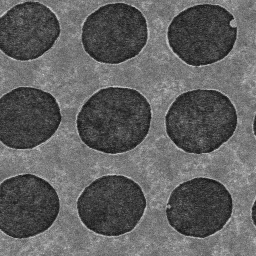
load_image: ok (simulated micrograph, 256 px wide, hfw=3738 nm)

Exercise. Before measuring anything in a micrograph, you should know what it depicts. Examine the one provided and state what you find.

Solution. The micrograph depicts holes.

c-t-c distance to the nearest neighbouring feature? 1260 nm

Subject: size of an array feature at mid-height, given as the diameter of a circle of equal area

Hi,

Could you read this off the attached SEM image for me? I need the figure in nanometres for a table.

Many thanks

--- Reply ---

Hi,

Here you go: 954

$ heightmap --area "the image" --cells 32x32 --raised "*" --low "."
**...*********..****************
*......*****......*****......***
.......****.......****.......***
........**........***.........**
.......***.........**.........**
.......***........***........***
......*****.......****.......***
**..********....*******.....****
********************************
********************************
********************************
*.....******.....******.....****
.......****.......****.......***
.......***.........**........***
........**.........**.........**
.......**..........**.........**
.......***.........**........***
......****........***.......****
*...*******......*****.....*****
********************************
********************************
********************************
.....*******....********...*****
.......****.......****......****
.......***........***........***
.......***........***........***
.......***........***........**.
.......***.......****........***
......*****......*****......****
*...*********..********...******
********************************
********************************